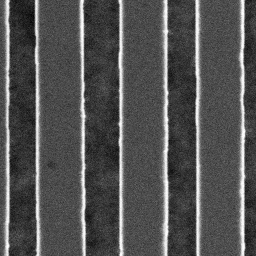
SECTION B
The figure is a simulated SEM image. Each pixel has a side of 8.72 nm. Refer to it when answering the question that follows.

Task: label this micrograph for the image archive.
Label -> lines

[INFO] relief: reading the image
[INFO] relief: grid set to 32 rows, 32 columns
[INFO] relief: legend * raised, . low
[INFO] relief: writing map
*...******.....******....*****..
*...******.....******....*****..
*...******.....******....*****..
*...******.....******....*****..
*....*****.....******....*****..
*....*****.....******....*****..
*....*****.....******....*****..
*....*****.....******....*****..
*....*****.....******....*****..
*....*****.....******....*****..
*....*****.....******....*****..
*....*****.....******....*****..
*....*****.....******....*****..
*....*****.....******....*****..
*....*****.....******....*****..
*....*****.....******....*****..
*....*****.....******....*****..
*....*****.....******....*****..
*....*****.....******....*****..
*....*****.....******....*****..
*....*****.....******....*****..
*....*****.....******....*****..
*....*****.....******....*****..
*....*****.....******....*****..
*....*****.....******....*****..
*....*****.....******....*****..
*....*****.....******....*****..
*....*****.....******....*****..
*....******....******....*****..
*....******....******....*****..
*....******....******....*****..
*....******....******....*****..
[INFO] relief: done